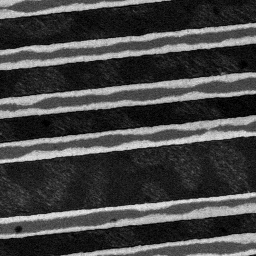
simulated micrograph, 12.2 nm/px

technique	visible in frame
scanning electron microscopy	lines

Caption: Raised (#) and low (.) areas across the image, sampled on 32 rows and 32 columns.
################................
#######.........................
................................
...........................#####
..................##############
.........####################...
####################............
##########......................
#...............................
.............................###
...................#############
..........######################
######################..........
############....................
................................
........................########
..............##################
.....####################.......
################................
#######.........................
................................
................................
................................
................................
.............................###
....................############
.........####################...
####################............
#############...................
###............................#
....................############
............####################